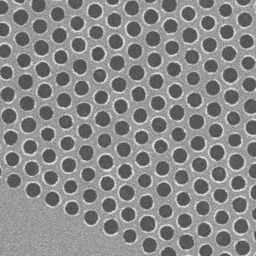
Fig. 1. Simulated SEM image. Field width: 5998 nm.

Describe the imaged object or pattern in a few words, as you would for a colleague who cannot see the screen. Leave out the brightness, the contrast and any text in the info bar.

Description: a regular array of holes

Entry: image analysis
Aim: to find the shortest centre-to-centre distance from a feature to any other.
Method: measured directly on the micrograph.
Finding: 21.2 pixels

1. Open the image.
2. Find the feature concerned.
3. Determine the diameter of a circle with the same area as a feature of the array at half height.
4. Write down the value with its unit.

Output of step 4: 15.1 pixels